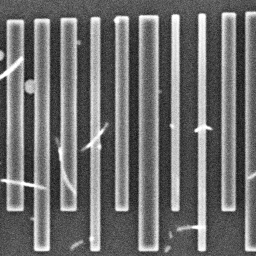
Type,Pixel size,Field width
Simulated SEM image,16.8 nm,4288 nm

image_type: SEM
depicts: groups of lines, slits or small figures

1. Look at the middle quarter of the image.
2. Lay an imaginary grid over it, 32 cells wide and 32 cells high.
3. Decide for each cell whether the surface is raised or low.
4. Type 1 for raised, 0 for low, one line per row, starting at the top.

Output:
11100001100001110001111000011000
11100001100001110001111000011000
11100001100001110001111000011000
11100001100001110001111000011000
11100001100001110001111000011000
11100001100001110001111000011000
11100001100001110001111000011000
11100001100001110001111000011000
11100001100001110001111000011000
11100001100001110001111000011000
11100001100001110001111000011000
11100001100001110001111000011000
11100001100001110001111000011000
11100001100001110001111000011000
11100001100001110001111000011000
11100001100001110001111000011000
11100001100001110001111000011000
11100001100001110001111000011000
11100001100001110001111000011000
11100001100001110001111000011000
11100011100001110001111000011000
11100001100001110001111000011000
11100001100001110001111000011000
11100001100001110001111000011000
11100001100001110001111000011000
11100001100001110001111000011000
11100001100001110001111000011000
11100001100001110001111000011000
11100001100001110001111000011000
11100001100001110001111000011000
11100001100001110001111000011000
11100001100001110001111000011000